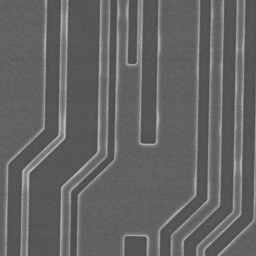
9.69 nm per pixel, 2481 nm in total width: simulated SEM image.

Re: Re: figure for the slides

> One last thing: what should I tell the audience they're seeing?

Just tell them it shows groups of lines, slits or small figures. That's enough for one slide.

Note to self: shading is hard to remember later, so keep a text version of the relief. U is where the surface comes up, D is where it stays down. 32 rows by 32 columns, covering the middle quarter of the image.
DDDDDDDDDUUDDUUUUUUDDDDUUUUUUUUU
DDDDDDDDDUUDDUUUUUUDDDDUUUUUUUUU
DDDDDDDDDUUDDUUUUUUDDDDUUUUUUUUU
DDDDDDDDDUUDDUUUUUUDDDDUUUUUUUUU
DDDDDDDDDUUDDUUUUUUDDDDUUUUUUUUU
DDDDDDDDDUUDDUUUUUUDDDDUUUUUUUUU
DDDDDDDDDUUDDUUUUUUDDDDUUUUUUUUU
DDDDDDDDDUUDDUUUUUUDDDDUUUUUUUUU
DDDDDDDDDUUDDUUUUUUDDDDUUUUUUUUU
DDDDDDDDDUUDDUUUUUUDDDDUUUUUUUUU
DDDDDDDDDUUDDUUUUUUDDDDUUUUUUUUU
DDDDDDDDDUUDDUUUUUUDDDDUUUUUUUUU
DDDDDDDDDUUDDUUUUUUDDDDUUUUUUUUU
DDDDDDDDDUUDDUUUUUUDDDDUUUUUUUUU
DDDDDDDDDUUDDUUUUUUDDDDUUUUUUUUU
DDDDDDDDDUUDDUUUUUUDDDDUUUUUUUUU
DDDDDDDDDUUDDUUUUUUDDDDUUUUUUUUU
DDDDDDDDDUUDDUUUUUUDDDDUUUUUUUUU
DDDDDDDDDUUDDUUUUUUDDDDUUUUUUUUU
DDDDDDDDDUUDDUUUUUUDDDDUUUUUUUUU
DDDDDDDDDUUDDUUUUUUUUUUUUUUUUUUU
DDDDDDDDUUUDDUUUUUUUUUUUUUUUUUUU
DDDDDDDDUUUDDUUUUUUUUUUUUUUUUUUU
DDDDDDDUUUDDDUUUUUUUUUUUUUUUUUUU
DDDDDDUUUDDDUUUUUUUUUUUUUUUUUUUU
DDDDDUUUDDDUUUUUUUUUUUUUUUUUUUUU
DDDDUUUDDDUUUUUUUUUUUUUUUUUUUUUU
DDDUUUDDDUUUUUUUUUUUUUUUUUUUUUUU
DDUUUDDDUUUUUUUUUUUUUUUUUUUUUUUU
DUUUDDDUUUUUUUUUUUUUUUUUUUUUUUUU
UUUDDDUUUUUUUUUUUUUUUUUUUUUUUUUU
UUDDDUUUUUUUUUUUUUUUUUUUUUUUUUUU